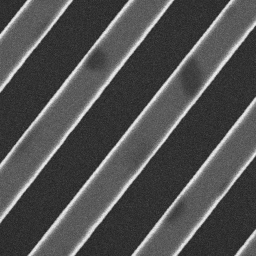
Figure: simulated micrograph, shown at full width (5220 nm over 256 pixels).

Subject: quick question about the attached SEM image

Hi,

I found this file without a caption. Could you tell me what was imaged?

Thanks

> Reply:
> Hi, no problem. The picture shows lines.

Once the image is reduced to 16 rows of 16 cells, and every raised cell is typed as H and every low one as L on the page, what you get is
LHHHLLLLHHLLLLHH
LHHLLLLHHHLLLHHH
HHHLLLHHHLLLHHHL
HHLLLHHHLLLLHHLL
HLLLLHHLLLLHHHLL
LLLLHHHLLLHHHLLL
LLLHHHLLLHHHLLLL
LLHHHLLLHHHLLLLH
LHHHLLLLHHHLLLHH
LHHLLLLHHHLLLHHH
HHHLLLHHHLLLLHHL
HHLLLHHHLLLLHHHL
HLLLLHHLLLLHHHLL
LLLLHHHLLLHHHLLL
LLLHHHLLLHHHLLLL
LLHHHLLLLHHLLLLH